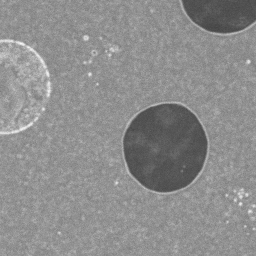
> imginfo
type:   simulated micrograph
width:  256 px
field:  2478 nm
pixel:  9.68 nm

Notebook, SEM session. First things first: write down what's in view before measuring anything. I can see holes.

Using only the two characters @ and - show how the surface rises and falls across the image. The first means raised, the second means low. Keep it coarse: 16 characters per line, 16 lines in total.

@@@@@@@@@@@@----
@@@@@@@@@@@@----
@@@@@@@@@@@@@@@@
@@@@@@@@@@@@@@@@
@@@@@@@@@@@@@@@@
@@@@@@@@@@@@@@@@
@@@@@@@@@@-@@@@@
@@@@@@@@----@@@@
@@@@@@@@-----@@@
@@@@@@@@-----@@@
@@@@@@@@-----@@@
@@@@@@@@@---@@@@
@@@@@@@@@@@@@@@@
@@@@@@@@@@@@@@@@
@@@@@@@@@@@@@@@@
@@@@@@@@@@@@@@@@